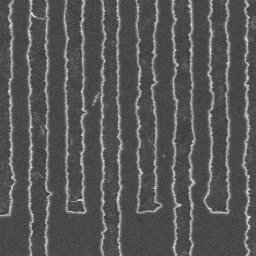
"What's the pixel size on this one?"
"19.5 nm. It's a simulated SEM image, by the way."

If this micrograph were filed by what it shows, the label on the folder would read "parallel lines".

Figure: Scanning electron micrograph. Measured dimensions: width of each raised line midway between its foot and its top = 408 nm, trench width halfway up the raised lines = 288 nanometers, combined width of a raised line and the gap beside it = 0.705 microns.